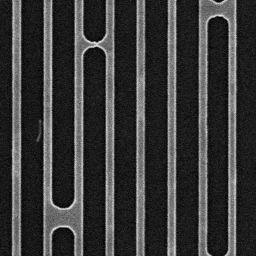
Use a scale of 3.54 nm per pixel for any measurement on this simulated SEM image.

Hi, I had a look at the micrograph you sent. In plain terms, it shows parallel lines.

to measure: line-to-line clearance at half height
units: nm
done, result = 84.1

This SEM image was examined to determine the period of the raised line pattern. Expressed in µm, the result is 0.109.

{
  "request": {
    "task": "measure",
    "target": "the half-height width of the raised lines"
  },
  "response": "26.1 nm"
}